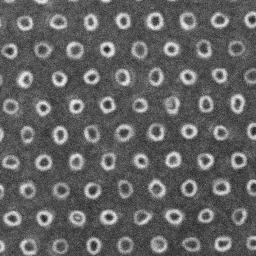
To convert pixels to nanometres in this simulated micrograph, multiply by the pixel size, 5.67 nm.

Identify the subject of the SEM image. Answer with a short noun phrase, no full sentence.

a regular array of raised bodies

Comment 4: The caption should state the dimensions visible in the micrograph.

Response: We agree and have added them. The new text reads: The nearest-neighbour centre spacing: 179 nm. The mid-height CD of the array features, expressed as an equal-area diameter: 82.4 nm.